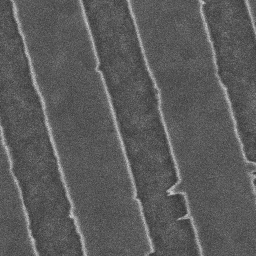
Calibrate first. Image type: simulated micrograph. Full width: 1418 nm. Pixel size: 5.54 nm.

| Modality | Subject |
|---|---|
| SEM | one or a few lines or trenches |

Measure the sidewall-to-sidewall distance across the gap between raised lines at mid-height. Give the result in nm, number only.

255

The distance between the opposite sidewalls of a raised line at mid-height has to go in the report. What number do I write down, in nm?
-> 370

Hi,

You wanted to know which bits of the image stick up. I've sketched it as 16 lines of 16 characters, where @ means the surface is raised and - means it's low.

-@@@@---@@@@@---
-@@@@---@@@@@---
-@@@@@---@@@@---
--@@@@---@@@@---
--@@@@---@@@@@--
--@@@@@---@@@@--
---@@@@---@@@@--
---@@@@---@@@@@-
---@@@@---@@@@@-
---@@@@@---@@@@-
@---@@@@---@@@@@
@---@@@@---@@@@@
@---@@@@@---@@@@
@@---@@@@---@@@@
@@---@@@@---@@@@
@@---@@@@---@@@@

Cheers